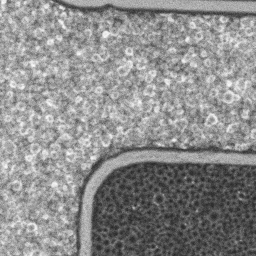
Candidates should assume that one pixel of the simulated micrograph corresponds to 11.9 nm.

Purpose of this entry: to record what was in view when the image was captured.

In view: one or a few lines or trenches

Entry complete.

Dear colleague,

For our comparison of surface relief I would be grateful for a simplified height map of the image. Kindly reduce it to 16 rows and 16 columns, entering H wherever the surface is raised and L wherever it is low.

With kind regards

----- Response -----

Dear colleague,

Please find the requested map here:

LLLLLLLLLLLLLLLL
LLLLLLLLLLLLLLLL
LLLLLLLLLLLLLLLL
LLLLLLLLLLLLLLLL
LLLLLLLLLLLLLLLL
LLLLLLLLLLLLLLLL
LLLLLLLLLLLLLLLL
LLLLLLLLLLLLLLLL
LLLLLLLLLLLLLLLL
LLLLLLLLLLLLLLLL
LLLLLLLHHHHHHHHH
LLLLLLHHHHHHHHHH
LLLLLHHHHHHHHHHH
LLLLLHHHHHHHHHHH
LLLLLHHHHHHHHHHH
LLLLLHHHHHHHHHHH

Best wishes